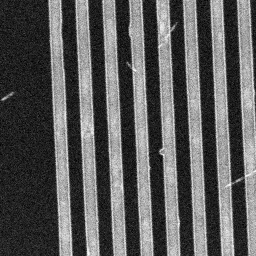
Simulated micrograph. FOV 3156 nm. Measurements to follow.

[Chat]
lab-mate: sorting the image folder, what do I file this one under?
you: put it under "parallel lines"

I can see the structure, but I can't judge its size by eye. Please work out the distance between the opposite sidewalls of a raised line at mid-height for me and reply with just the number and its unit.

0.203 um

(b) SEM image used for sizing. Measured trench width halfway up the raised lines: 134 nanometers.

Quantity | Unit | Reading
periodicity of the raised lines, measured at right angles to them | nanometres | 332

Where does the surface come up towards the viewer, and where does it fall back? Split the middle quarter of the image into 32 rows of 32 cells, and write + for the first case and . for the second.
++++...++++..++++...++++...++++.
++++...++++..+++++..++++...++++.
++++...++++..++++...++++...++++.
++++...++++..++++...++++...++++.
++++...++++..++++...++++...++++.
++++...++++...+++...++++...++++.
++++...++++...+++...++++...++++.
++++...++++...++++..++++...++++.
++++...++++...++++..++++...++++.
++++...++++...++++..++++...++++.
++++...++++...++++..++++...++++.
++++...++++...++++...+++...++++.
++++...++++...++++...+++...++++.
++++...++++...++++...++++..++++.
++++...++++...++++...++++...+++.
.+++...++++...++++...++++...+++.
.+++...++++...++++...++++...+++.
.+++...++++...++++...++++...+++.
.+++...++++...++++...++++...+++.
.+++...++++...++++...++++...++++
.++++..++++...++++...++++...++++
.++++...+++...++++...+++....++++
.++++...+++...++++...++++...++++
.++++...++++..++++...++++...++++
.++++...++++..++++...++++...++++
.++++...++++..++++...++++...++++
.++++...++++..++++...++++...++++
.++++...++++...+++...++++...++++
.++++...++++...+++...++++...++++
.++++...++++...++++..++++...++++
.++++...++++...++++..++++...++++
.++++...++++...++++..++++...++++